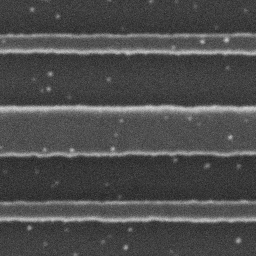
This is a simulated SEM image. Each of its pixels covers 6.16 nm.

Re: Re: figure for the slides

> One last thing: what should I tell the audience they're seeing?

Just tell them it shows lines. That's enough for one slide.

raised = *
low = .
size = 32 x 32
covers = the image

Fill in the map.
................................
................................
................................
................................
********************************
********************************
****.***************************
................................
................................
................................
................................
................................
................................
********************************
********************************
********************************
********************************
********************************
********************************
.....*..*.......................
................................
................................
................................
................................
................................
********************************
********************************
***********.*******.************
................................
................................
................................
................................